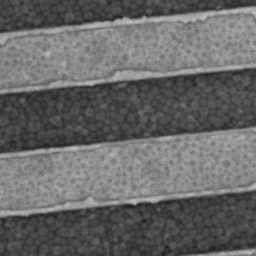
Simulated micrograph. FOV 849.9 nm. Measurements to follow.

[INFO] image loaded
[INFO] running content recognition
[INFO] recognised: one or a few lines or trenches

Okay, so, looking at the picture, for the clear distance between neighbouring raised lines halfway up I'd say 203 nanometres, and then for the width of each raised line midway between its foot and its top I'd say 200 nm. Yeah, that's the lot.